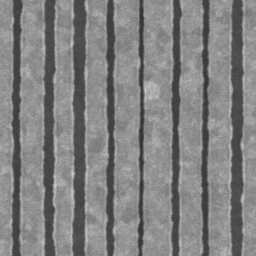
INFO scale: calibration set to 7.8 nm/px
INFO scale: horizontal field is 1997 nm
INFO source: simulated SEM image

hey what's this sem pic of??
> parallel lines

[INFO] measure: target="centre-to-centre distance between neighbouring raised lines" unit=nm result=244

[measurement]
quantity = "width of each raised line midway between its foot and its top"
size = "172 nm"